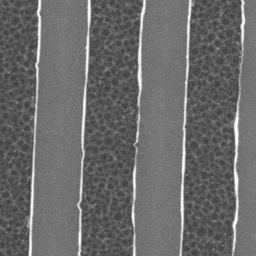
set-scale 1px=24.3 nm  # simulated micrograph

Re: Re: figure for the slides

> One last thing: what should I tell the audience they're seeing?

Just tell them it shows one or a few lines or trenches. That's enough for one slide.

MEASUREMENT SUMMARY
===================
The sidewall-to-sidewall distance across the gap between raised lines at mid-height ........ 1160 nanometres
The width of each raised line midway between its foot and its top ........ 1310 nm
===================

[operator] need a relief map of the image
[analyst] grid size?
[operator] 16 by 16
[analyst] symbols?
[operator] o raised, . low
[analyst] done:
oo....ooo...ooo.
oo....ooo...ooo.
oo....ooo...ooo.
oo...oooo...ooo.
oo...oooo...ooo.
oo...oooo...ooo.
oo...oooo...ooo.
oo...oooo...ooo.
oo...oooo...ooo.
oo...oooo..oooo.
oo...ooo...oooo.
oo...ooo...oooo.
oo...ooo...oooo.
oo...ooo...oooo.
oo...ooo...oooo.
oo...ooo...oooo.